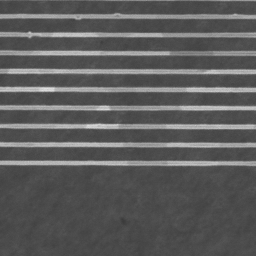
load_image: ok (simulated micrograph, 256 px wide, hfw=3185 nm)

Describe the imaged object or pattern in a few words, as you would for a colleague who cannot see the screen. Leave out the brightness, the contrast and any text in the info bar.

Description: parallel lines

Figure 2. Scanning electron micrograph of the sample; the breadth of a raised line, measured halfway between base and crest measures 45.1 nm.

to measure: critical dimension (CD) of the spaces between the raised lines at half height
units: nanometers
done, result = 184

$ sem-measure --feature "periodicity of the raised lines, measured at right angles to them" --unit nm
228